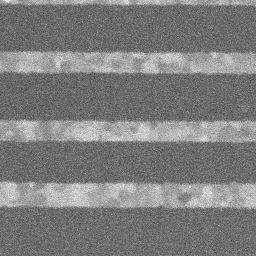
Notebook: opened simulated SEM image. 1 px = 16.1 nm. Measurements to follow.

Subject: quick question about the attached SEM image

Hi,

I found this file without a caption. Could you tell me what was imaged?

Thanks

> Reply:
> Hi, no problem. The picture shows one or a few lines or trenches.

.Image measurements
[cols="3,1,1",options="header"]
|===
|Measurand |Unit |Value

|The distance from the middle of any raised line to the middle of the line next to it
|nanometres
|1070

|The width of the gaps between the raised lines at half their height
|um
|0.789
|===